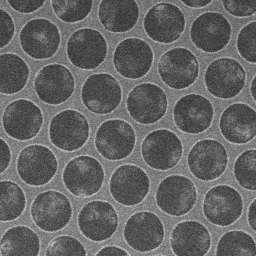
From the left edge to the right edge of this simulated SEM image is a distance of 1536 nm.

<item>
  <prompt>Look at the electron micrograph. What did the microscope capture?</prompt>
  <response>a regular array of holes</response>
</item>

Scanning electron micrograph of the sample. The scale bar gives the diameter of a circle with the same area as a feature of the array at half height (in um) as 0.244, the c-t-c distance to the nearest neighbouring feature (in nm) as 283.